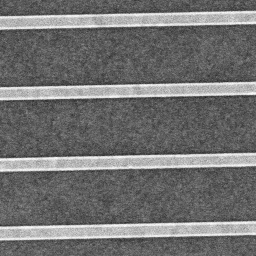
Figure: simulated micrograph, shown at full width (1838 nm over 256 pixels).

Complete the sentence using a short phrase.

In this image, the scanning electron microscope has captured one or a few lines or trenches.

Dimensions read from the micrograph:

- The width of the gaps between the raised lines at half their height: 430 nanometres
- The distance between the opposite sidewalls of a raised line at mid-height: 79.9 nanometres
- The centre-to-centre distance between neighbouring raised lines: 0.504 microns